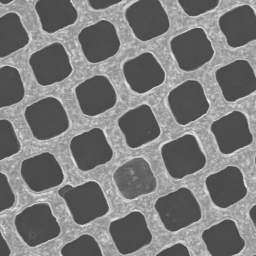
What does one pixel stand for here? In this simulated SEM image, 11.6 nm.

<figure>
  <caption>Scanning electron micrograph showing a regular array of holes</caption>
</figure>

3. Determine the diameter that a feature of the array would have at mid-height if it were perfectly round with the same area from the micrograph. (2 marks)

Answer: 467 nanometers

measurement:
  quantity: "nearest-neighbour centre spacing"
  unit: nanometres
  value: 612